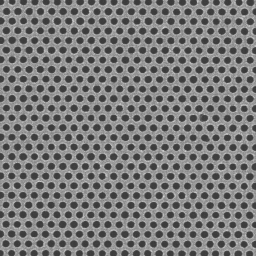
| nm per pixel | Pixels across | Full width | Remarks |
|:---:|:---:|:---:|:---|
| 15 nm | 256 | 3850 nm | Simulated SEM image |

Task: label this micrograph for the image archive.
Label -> a regular array of holes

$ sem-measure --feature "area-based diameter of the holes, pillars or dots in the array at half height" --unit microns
0.107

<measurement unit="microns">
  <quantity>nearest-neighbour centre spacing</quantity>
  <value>0.165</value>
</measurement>